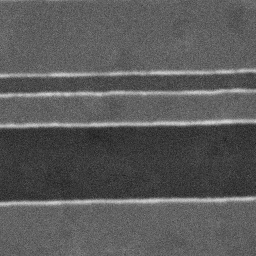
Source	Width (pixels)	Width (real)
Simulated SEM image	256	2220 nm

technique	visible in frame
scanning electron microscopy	lines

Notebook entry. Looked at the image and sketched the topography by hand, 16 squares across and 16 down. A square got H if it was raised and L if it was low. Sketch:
HHHHHHHHHHHHHHHH
HHHHHHHHHHHHHHHH
HHHHHHHHHHHHHHHH
HHHHHHHHHHHHHHHH
HHHHHHHHHHHHHHHH
HHHHHHHHHHHHHHHH
HHHHHHHHHHHHHHHH
HHHHHHHHHHHHHHHH
LLLLLLLLLLLLLLLL
LLLLLLLLLLLLLLLL
LLLLLLLLLLLLLLLL
LLLLLLLLLLLLLLLL
LLLLLLLLLLLLLHHH
HHHHHHHHHHHHHHHH
HHHHHHHHHHHHHHHH
HHHHHHHHHHHHHHHH